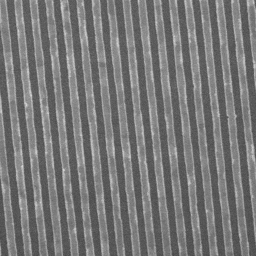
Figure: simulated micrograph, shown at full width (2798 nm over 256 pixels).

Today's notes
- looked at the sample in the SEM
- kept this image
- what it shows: parallel lines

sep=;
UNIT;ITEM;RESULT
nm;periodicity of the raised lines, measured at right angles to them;168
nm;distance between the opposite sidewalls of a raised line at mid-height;74.8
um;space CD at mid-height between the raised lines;0.0938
